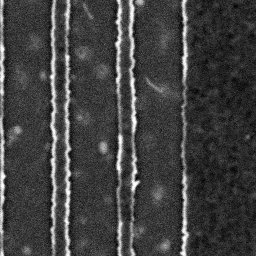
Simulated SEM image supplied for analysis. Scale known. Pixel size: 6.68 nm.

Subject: one or a few lines or trenches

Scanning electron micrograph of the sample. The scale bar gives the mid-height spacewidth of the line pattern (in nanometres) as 330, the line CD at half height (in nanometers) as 104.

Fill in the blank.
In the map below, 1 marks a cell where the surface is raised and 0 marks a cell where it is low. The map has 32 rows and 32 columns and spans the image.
00000001100000011100000111111111
00000001100000011000000111111111
00000001100000011000000111111111
00000001100000010000000111111111
00000011000000011000000111111111
00000001000000011000000111111111
00000001000000011000000111111111
00000001100000011000000111111111
00000001100000011000000111111111
00000001100000011000000111111111
00000011100000011000000111111111
00000001100000011000000111111111
00000001100000011000000111111111
00000001000000011000000111111111
00000001000000011000000111111111
00000011100000011000000111111111
00000001100000011000000111111111
00000001100000011000000111111111
00000011100000011000000111111111
00000001100000011000000111111111
00000001100000011000000111111111
00000001100000011000000111111111
00000001100000011000000111111111
00000001100000011000000111111111
00000001100000011000000111111111
00000001100000011000000111111111
00000001100000011000000111111111
00000001000000011000000111111111
00000011000000011000000111111111
00000001100000011000000111111111
00000001100000010000000111111111
00000001100000011000000111111111